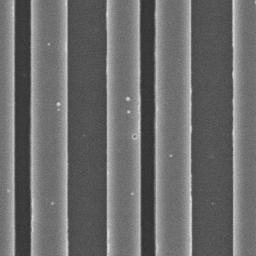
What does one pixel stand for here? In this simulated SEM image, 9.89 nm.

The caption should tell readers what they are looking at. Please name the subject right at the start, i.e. lines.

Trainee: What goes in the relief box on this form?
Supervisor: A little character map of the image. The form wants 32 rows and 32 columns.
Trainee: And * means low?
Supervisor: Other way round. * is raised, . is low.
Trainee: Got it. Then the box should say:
**..****.....****...****.....***
**..****.....****..*****.....***
**..****.....****..*****.....***
**..****.....****...****.....***
**..****.....****...****.....***
**..****.....****..*****.....***
**..****.....****..*****.....***
**..****.....****..*****.....***
**..****.....****...****.....***
**..****.....****..*****.....***
**..****.....****..*****.....***
**..****.....****..*****.....***
**..****.....****...****.....***
**..****.....****...****.....***
**..****.....****...****.....***
**..****.....****..*****.....***
**..****.....****..*****.....***
**..****.....****...****.....***
**..****.....****..*****.....***
**..****.....****..*****.....***
**..****.....****..*****.....***
**..****.....****...****.....***
**..****.....****...****.....***
**..****.....****..*****.....***
**..****.....****..*****.....***
**..****.....****...****.....***
**..****.....****...****.....***
**..****.....****...****.....***
**..****.....****...****.....***
**..****.....****...****.....***
**..****.....****...****.....***
**..****.....****...****.....***